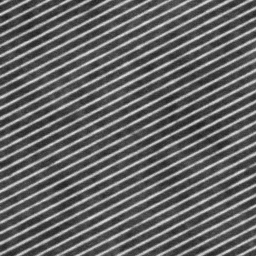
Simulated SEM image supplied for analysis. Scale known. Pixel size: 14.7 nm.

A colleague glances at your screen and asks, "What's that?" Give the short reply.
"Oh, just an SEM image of parallel lines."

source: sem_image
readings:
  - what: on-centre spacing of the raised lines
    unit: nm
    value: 136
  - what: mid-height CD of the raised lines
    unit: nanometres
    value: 24.5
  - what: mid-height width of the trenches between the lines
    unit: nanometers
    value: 111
